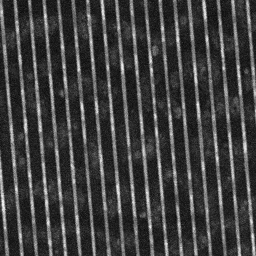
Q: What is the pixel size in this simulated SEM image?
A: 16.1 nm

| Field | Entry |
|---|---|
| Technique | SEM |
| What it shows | parallel lines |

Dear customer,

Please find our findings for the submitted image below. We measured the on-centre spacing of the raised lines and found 0.233 micrometres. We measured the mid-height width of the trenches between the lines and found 0.203 microns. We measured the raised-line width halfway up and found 32.1 nanometres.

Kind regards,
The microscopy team